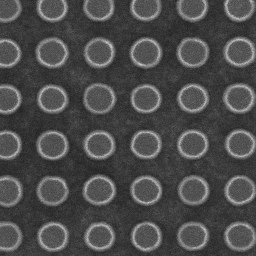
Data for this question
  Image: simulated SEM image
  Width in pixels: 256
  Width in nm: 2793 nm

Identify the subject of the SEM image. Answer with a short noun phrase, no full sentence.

a regular array of raised bodies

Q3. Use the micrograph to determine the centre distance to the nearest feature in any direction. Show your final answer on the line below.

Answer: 0.501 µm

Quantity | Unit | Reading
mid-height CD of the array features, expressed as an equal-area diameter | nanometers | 314